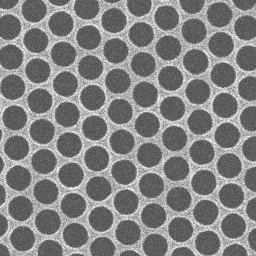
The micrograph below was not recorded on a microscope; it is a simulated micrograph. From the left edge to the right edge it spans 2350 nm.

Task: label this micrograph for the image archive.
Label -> a regular array of holes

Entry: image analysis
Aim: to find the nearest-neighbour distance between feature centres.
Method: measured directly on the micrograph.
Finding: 276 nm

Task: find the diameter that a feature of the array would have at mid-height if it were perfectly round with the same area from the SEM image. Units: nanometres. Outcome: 237